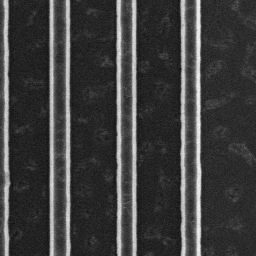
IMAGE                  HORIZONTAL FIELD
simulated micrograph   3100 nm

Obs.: one or a few lines or trenches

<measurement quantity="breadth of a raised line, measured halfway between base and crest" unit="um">0.191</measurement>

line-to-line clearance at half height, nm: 592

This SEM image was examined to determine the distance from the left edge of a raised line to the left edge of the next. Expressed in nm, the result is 791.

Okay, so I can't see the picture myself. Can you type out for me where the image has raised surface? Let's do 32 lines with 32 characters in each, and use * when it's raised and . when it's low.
*.....***......**......**.......
*.....***......**......**.......
*.....***......**......**.......
*.....***......**......**.......
*.....***......**......**.......
*.....***......**......**.......
*.....***......**......**.......
*.....***......**......**.......
*.....**.......**......**.......
*.....**.......**......**.......
*.....**.......**......**.......
*.....***......**......**.......
*.....**.......**......**.......
*.....***......**......**.......
*.....***......**......**.......
*.....***......**......**.......
*.....***......**......**.......
*.....***......**......**.......
*.....***......**......**.......
*.....***......**......**.......
*.....***......**......**.......
*.....***......**......**.......
*.....***......**......**.......
*.....**.......**......**.......
*.....***......**......**.......
*.....***......**......**.......
*.....***......**......**.......
*.....**.......**......**.......
*.....**.......**......**.......
*.....**.......**......**.......
*.....***......**......**.......
*.....***......**......**.......